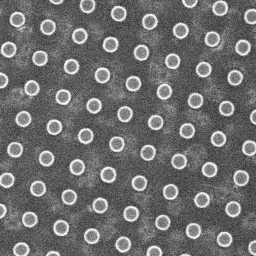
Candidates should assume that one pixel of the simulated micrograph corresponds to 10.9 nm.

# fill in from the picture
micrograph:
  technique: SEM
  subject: a regular array of raised bodies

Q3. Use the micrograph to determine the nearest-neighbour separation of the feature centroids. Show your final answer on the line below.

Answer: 0.344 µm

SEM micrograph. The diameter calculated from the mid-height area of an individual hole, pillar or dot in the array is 159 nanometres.